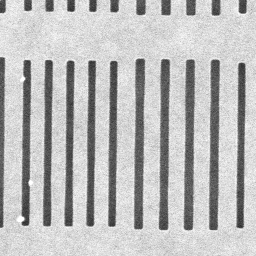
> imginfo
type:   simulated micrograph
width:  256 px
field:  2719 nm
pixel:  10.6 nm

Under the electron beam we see groups of lines, slits or small figures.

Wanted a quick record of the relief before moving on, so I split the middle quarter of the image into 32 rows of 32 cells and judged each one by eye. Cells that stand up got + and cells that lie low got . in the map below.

...+++..+++...++++..++++...+++..
...+++..+++...++++..++++...+++..
...+++..+++...++++..++++...+++..
...+++..+++...++++..++++...+++..
...+++..+++...++++..++++...+++..
...+++..+++...++++..++++...+++..
...+++..+++...++++..++++...+++..
...+++..+++..+++++..++++...+++..
...+++..+++..+++++..++++...+++..
...+++..+++..+++++..++++...+++..
...+++..+++..+++++..++++...+++..
...+++..+++..+++++..++++..++++..
...+++..+++..+++++..++++..++++..
...+++..+++..+++++..++++..++++..
...+++..+++..+++++..++++..++++..
...+++..+++..+++++..++++..++++..
...+++..+++..+++++..++++..++++..
...+++..+++..++++...++++..++++..
...+++..+++..++++...++++..++++..
...+++..+++..++++...++++..++++..
...+++..+++..++++...++++..++++..
..++++..+++..++++...++++..++++..
..++++..+++..++++...++++..++++..
..++++..+++..++++...++++..++++..
..++++..+++..++++...++++..++++..
..++++..+++..++++...++++..++++..
..++++..+++..++++...++++..++++..
..++++..+++..++++...++++..++++..
..++++..+++..++++...++++..++++..
..++++..+++..++++...++++..++++..
..++++..+++..++++...++++..++++..
..+++...+++..++++...++++..++++..